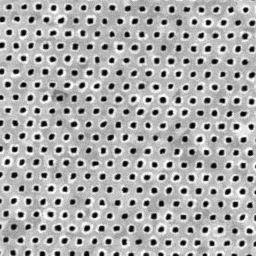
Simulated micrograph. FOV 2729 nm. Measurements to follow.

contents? a regular array of holes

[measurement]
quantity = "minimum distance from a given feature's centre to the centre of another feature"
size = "153 nanometers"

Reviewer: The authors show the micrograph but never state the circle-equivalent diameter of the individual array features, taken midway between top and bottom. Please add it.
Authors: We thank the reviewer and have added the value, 0.0669 micrometres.